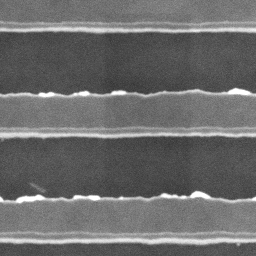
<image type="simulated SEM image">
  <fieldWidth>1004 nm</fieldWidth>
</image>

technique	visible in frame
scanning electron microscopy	lines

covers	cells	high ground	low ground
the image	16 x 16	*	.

****************
****************
................
................
................
................
****************
****************
................
................
................
................
.***************
****************
****************
................